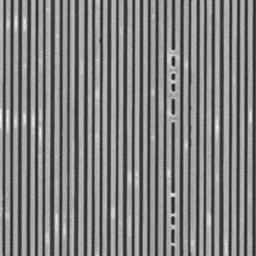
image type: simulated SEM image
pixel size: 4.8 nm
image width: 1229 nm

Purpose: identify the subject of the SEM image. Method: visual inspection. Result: parallel lines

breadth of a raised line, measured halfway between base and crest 25.2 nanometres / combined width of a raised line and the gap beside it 38.7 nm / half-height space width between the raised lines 0.0126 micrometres